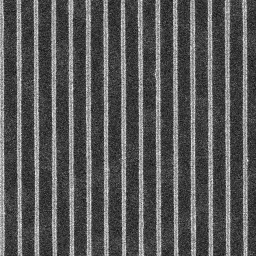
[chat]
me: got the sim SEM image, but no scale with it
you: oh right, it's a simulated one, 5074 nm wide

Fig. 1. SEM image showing parallel lines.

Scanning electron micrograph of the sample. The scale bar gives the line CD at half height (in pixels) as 3.75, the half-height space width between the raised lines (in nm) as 268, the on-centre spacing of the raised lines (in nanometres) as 344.